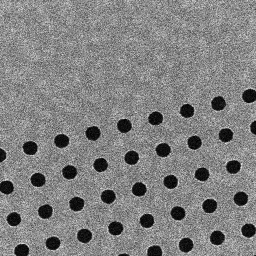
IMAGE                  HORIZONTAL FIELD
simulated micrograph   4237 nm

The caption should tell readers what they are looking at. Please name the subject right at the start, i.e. a regular array of holes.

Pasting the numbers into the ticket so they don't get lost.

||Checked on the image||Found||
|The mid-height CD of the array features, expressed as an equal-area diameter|241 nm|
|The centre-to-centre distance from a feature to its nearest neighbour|531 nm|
